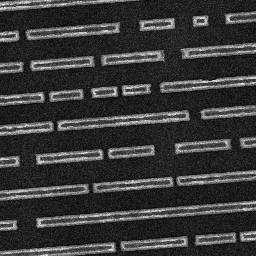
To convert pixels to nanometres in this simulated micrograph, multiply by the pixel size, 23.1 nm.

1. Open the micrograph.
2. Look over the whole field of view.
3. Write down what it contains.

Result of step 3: parallel lines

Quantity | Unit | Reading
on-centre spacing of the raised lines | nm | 722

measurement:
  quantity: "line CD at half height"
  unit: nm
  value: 184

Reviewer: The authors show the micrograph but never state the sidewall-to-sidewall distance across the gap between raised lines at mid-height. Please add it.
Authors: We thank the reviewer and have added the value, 23.1 px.